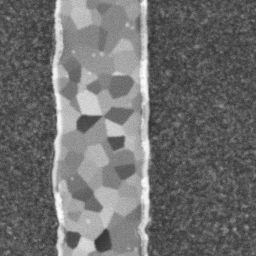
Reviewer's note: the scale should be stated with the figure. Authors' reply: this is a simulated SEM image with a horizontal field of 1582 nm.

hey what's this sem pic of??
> one or a few lines or trenches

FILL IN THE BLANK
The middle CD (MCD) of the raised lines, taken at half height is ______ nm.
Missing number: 552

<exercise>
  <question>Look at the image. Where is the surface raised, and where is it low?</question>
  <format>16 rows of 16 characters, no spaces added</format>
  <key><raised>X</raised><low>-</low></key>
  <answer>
----XXXXX-------
----XXXXX-------
----XXXXX-------
---XXXXXX-------
---XXXXXX-------
---XXXXXX-------
----XXXXX-------
----XXXXX-------
----XXXXX-------
---XXXXXX-------
---XXXXXX-------
---XXXXXX-------
---XXXXXX-------
----XXXXX-------
----XXXXX-------
----XXXXX-------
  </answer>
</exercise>